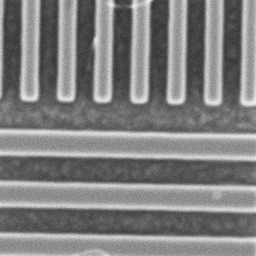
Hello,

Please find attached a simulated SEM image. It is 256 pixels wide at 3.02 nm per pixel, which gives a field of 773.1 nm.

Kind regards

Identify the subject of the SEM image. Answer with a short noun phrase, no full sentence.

groups of lines, slits or small figures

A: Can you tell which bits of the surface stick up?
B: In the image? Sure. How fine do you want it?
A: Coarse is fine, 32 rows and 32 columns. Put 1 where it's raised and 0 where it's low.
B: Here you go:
00011001100011000110011000110011
00011001100011000110011000110011
00011001100011000110011000110011
00011001100011000110011000110011
00011001100011000110011000110011
00011001100011000110011000110011
00011001100011000110011000110011
00011001100011001100011000110011
00011001100011001100011000110011
00011001100011001100011000110011
00011001100011001100011000110011
00011001100011001100011000110011
00010000100011000100011000110011
00000000000000000000000000000000
00000000000000000000000000000000
00000000000000000000000000000000
11111111000000000000000000000000
11111111111111111111111111111111
11111111111111111111111111111111
00000000000001111111111111111111
00000000000000000000000000000000
00000000000000000000000000000000
00000000000000000000000000000000
11111111111111111111111111111111
11111111111111111111111111111111
11111111111111111111111111111111
00000000000000000000000000000000
00000000000000000000000000000000
00000000000000000000000000000000
11111111111111111000000000000000
11111111111111111111111111111111
11111111111111111111111111111111